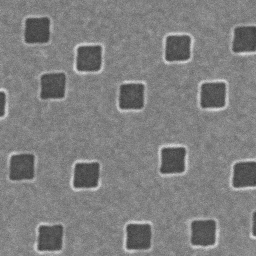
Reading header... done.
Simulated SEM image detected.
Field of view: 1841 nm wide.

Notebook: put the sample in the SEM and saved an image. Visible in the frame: a regular array of holes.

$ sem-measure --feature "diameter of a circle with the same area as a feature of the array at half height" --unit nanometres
211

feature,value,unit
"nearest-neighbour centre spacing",441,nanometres